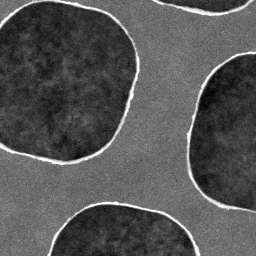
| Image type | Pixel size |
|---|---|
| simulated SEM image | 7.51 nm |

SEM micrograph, holes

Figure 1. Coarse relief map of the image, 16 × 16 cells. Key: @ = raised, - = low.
@----@@@@@@----@
-------@@@@@@@@@
--------@@@@@@@@
---------@@@@@@-
---------@@@@---
--------@@@@@---
--------@@@@----
--------@@@@----
-------@@@@@----
@-----@@@@@@----
@@@@@@@@@@@@----
@@@@@@@@@@@@----
@@@@@@@@@@@@@---
@@@@@-----@@@@@@
@@@@--------@@@@
@@@---------@@@@